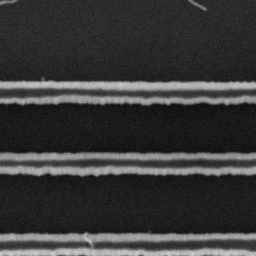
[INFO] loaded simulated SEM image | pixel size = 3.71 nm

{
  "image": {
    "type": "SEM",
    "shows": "lines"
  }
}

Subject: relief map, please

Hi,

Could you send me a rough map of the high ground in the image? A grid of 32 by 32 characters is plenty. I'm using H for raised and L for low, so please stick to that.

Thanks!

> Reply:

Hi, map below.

LLLLLLLLLLLLLLLLLLLLLLLLLLLLLLLL
LLLLLLLLLLLLLLLLLLLLLLLLLLLLLLLL
LLLLLLLLLLLLLLLLLLLLLLLLLLLLLLLL
LLLLLLLLLLLLLLLLLLLLLLLLLLLLLLLL
LLLLLLLLLLLLLLLLLLLLLLLLLLLLLLLL
LLLLLLLLLLLLLLLLLLLLLLLLLLLLLLLL
LLLLLLLLLLLLLLLLLLLLLLLLLLLLLLLL
LLLLLLLLLLLLLLLLLLLLLLLLLLLLLLLL
LLLLLLLLLLLLLLLLLLLLLLLLLLLLLLLL
LLLLLLLLLLLLLLLLLLLLLLLLLLLLLLLL
HHHHHHHHHHHLHLLLLLLLLLLLLHLLLHLH
HHHHHHHHHHHHHHHHHHHHHHHHHHHHHHHH
HHHHHHHHHHHHHHHHHHHHHHHHHHHHHHHH
LLLLLLLLLLLLLLLLLLLLLLLLLLLLLLLL
LLLLLLLLLLLLLLLLLLLLLLLLLLLLLLLL
LLLLLLLLLLLLLLLLLLLLLLLLLLLLLLLL
LLLLLLLLLLLLLLLLLLLLLLLLLLLLLLLL
LLLLLLLLLLLLLLLLLLLLLLLLLLLLLLLL
LLLLLLLLLLLLLLLLLLLLLLLLLLLLLLLL
HHHHHHHHHHHHHHHHHHHHHHHHHHHHHHHH
HHHHHHHHHHHHHHHHHHHHHHHHHHHHHHHH
LHLHHHHHHHHHHHHLLHHHHHHHHHHHHHHH
LLLLLLLLLLLLLLLLLLLLLLLLLLLLLLLL
LLLLLLLLLLLLLLLLLLLLLLLLLLLLLLLL
LLLLLLLLLLLLLLLLLLLLLLLLLLLLLLLL
LLLLLLLLLLLLLLLLLLLLLLLLLLLLLLLL
LLLLLLLLLLLLLLLLLLLLLLLLLLLLLLLL
LLLLLLLLLLLLLLLLLLLLLLLLLLLLLLLL
LLLLLLLLLLLLLLLLLLLLLLLLLLLLLLLL
LHLHHLLLLLHLLHLLLHLLLHLHHHHHHHHH
HHHHHHHHHHHHHHHHHHHHHHHHHHHHHHHH
HHHHHHHHHHHHHHHHHHHHHHHHHHHHHHHH